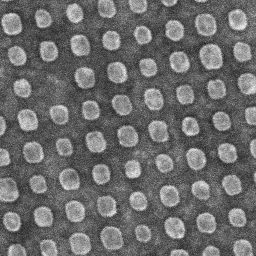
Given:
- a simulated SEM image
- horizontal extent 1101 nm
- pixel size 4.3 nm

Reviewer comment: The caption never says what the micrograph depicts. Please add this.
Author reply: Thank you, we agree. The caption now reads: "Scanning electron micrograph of a regular array of raised bodies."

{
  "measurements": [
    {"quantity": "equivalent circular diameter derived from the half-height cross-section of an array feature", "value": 81.1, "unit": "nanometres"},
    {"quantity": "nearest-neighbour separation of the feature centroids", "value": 137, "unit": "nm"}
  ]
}